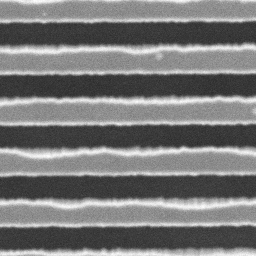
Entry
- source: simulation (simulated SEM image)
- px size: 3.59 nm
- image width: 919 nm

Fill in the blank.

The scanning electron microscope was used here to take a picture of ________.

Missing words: lines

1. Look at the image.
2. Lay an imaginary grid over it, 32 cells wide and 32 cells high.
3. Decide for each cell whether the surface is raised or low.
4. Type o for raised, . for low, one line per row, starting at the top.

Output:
oooooooooooooooooooooooooooooooo
oooooooooooooooooooooooooooooooo
oooooooooooooooooooooooooooooooo
................................
................................
................................
oooooooooooooooooooooooooooooooo
oooooooooooooooooooooooooooooooo
oooooooooooooooooooooooooooooooo
................................
................................
................................
..oooooooooooooooooooooooooooooo
oooooooooooooooooooooooooooooooo
oooooooooooooooooooooooooooooooo
ooooooooooooooooo....o....o.....
................................
................................
..........................o.....
oooooooooooooooooooooooooooooooo
oooooooooooooooooooooooooooooooo
oooooooooooooooooooooooooooooooo
................................
................................
................................
oooooooooooooooooooooooooooooooo
oooooooooooooooooooooooooooooooo
oooooooooooooooooooooooooooooooo
................................
................................
................................
...ooo....ooooo.................